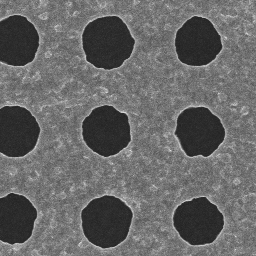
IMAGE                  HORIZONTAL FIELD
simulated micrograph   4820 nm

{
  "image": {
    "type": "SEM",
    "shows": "holes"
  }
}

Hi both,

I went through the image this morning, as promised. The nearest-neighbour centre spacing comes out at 1680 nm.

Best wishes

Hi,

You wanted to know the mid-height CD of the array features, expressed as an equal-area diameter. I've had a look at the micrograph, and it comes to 930 nm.